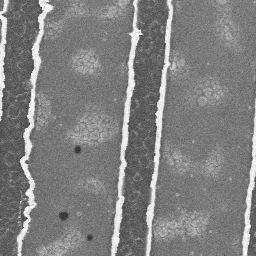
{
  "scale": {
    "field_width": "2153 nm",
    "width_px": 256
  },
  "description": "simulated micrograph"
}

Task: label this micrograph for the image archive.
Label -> one or a few lines or trenches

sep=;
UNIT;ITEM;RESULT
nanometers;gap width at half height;790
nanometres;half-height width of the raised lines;297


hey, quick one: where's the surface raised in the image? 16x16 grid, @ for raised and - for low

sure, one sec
@@@-----@@@-----
@@@-----@@@-----
@@------@@@-----
@@------@@------
@@------@@------
@@------@@------
@@------@@------
@@------@@------
@@------@@------
@@------@@------
@@------@@------
@@-----@@@------
@@-----@@@------
@@-----@@------@
@------@@------@
@------@@------@